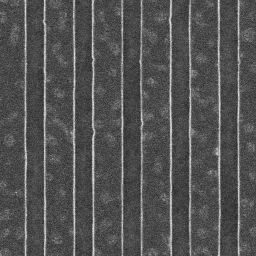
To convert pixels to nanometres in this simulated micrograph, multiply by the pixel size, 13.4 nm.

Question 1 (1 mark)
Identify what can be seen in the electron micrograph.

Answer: parallel lines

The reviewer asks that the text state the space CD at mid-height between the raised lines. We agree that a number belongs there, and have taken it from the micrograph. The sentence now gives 247 nanometers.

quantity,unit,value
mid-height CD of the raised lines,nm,394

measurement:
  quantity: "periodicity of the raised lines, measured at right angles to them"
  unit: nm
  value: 646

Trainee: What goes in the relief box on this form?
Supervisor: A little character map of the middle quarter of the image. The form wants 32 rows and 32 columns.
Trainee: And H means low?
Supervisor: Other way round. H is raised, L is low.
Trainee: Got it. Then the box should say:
HHHLLLLHHHHHHHLLLLLHHHHHHHHLLLLL
HHHLLLLHHHHHHHLLLLLHHHHHHHHLLLLH
HHHLLLLHHHHHHHLLLLLHHHHHHHHLLLLL
HHHLLLLHHHHHHHLLLLLHHHHHHHHLLLLH
HHHLLLLHHHHHHHLLLLLHHHHHHHHLLLLH
HHHLLLLHHHHHHHLLLLLHHHHHHHHLLLLH
HHLLLLLHHHHHHHLLLLLHHHHHHHHLLLLL
HHLLLLLHHHHHHHLLLLLHHHHHHHHLLLLL
HHLLLLLHHHHHHHLLLLLHHHHHHHHLLLLL
HHLLLLLHHHHHHHLLLLLHHHHHHHHLLLLL
HHLLLLLHHHHHHHLLLLLHHHHHHHLLLLLL
HHLLLLLHHHHHHHLLLLLHHHHHHHHLLLLL
HHLLLLLHHHHHHHLLLLLHHHHHHHHLLLLL
HHLLLLLHHHHHHHHLLLLHHHHHHHHLLLLH
HHLLLLLHHHHHHHHLLLLLHHHHHHHLLLLL
HHLLLLLHHHHHHHHLLLLLHHHHHHHLLLLL
HHLLLLLLHHHHHHLLLLLLHHHHHHHLLLLL
HHLLLLLLHHHHHHLLLLLLHHHHHHHLLLLL
HHLLLLLHHHHHHHLLLLLLHHHHHHHLLLLL
HHLLLLLHHHHHHHLLLLLLHHHHHHHLLLLL
HHLLLLLHHHHHHHLLLLLLHHHHHHHLLLLL
HHLLLLLHHHHHHHHLLLLLHHHHHHHLLLLL
HHHLLLLHHHHHHHHLLLLLHHHHHHHLLLLL
HHLLLLLHHHHHHHLLLLLLHHHHHHHLLLLL
HHLLLLLHHHHHHHLLLLLLHHHHHHHLLLLL
HHLLLLLHHHHHHHLLLLLLHHHHHHHLLLLL
HHLLLLLHHHHHHHHLLLLLHHHHHHHLLLLL
HHLLLLLHHHHHHHHLLLLLHHHHHHHLLLLL
HHLLLLLHHHHHHHHLLLLLHHHHHHHLLLLL
HHLLLLLLHHHHHHLLLLLLHHHHHHHLLLLL
HHLLLLLHHHHHHHLLLLLLHHHHHHHLLLLL
HHLLLLLHHHHHHHLLLLLHHHHHHHHLLLLL